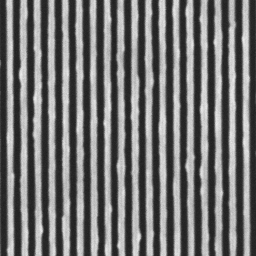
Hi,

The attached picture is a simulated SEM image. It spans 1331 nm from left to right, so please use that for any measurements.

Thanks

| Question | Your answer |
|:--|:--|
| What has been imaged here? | parallel lines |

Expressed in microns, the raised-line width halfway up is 0.0364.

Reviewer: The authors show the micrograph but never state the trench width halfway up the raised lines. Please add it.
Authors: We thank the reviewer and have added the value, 36.4 nm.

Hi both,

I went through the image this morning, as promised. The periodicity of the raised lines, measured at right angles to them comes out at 72.1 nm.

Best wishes